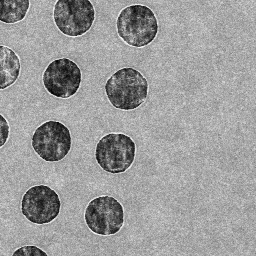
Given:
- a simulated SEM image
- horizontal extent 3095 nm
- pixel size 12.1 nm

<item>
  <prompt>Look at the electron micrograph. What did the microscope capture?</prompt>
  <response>holes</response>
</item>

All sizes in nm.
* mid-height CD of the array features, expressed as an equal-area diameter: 482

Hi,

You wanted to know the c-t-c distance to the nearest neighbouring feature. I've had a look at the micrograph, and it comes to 777 nm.